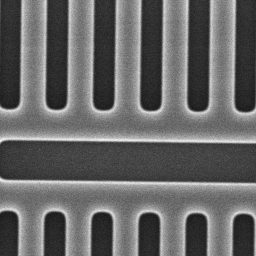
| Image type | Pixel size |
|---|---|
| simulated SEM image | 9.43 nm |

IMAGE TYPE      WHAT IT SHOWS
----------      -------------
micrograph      groups of lines, slits or small figures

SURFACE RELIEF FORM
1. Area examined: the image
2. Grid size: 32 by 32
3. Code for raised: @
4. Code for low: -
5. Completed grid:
---@@@---@@@---@@@---@@---@@@---
---@@@---@@@---@@@--@@@---@@@---
---@@@---@@@---@@---@@@---@@@---
---@@@---@@@---@@---@@@---@@@---
---@@@---@@@---@@---@@@---@@@---
---@@@---@@@---@@---@@@---@@@---
---@@@---@@@---@@---@@@---@@@---
---@@@---@@@---@@---@@@---@@@---
---@@@---@@@---@@---@@@---@@@---
---@@@---@@@---@@---@@@---@@@---
---@@@---@@@--@@@---@@@---@@@---
---@@@---@@---@@@---@@@---@@@---
---@@@---@@@--@@@---@@@---@@@---
--@@@@--@@@@--@@@@--@@@@--@@@---
@@@@@@@@@@@@@@@@@@@@@@@@@@@@@@@@
@@@@@@@@@@@@@@@@@@@@@@@@@@@@@@@@
@@@@@@@@@@@@@@@@@@@@@@@@@@@@@@@@
@--------------@@@@@@@@@@@@@@@@@
--------------------------------
--------------------------------
--------------------------------
--------------------------------
@-------------------------------
@@@@@@@@@@@@@@@@@@@@@@@@@@@@@@@@
@@@@@@@@@@@@@@@@@@@@@@@@@@@@@@@@
@@@@@@@@@@@@@@@@@@@@@@@@@@@@@@@@
--@@@@--@@@@-@@@@@-@@@@@@@@@@@@@
--@@@@--@@@---@@@---@@@---@@@---
--@@@---@@@---@@@---@@@---@@@---
--@@@---@@@---@@@---@@@---@@@---
--@@@---@@@---@@@---@@@---@@@---
--@@@---@@@---@@@---@@@---@@@---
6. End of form